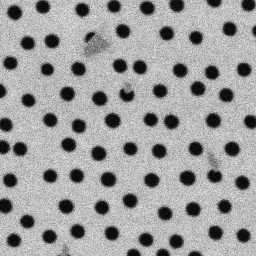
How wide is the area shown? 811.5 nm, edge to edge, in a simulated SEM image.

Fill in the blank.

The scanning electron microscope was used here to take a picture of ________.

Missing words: a regular array of holes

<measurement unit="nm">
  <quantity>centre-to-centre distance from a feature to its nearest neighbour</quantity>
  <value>87.8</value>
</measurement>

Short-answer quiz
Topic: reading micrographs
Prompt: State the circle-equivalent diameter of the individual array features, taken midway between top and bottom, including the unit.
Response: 43.8 nm